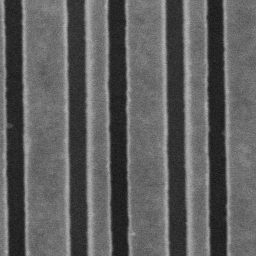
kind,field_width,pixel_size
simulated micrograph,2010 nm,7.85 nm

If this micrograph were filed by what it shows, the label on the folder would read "lines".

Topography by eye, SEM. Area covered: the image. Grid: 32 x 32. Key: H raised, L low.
LLLHHHHHLLLHHLLLHHHHHLLHHHLLHHHH
LLLHHHHHLLLHHLLLHHHHHLLHHHLLHHHH
LLLHHHHHLLLHHLLLHHHHHLLHHHLLHHHH
HLLHHHHHLLLHHLLLHHHHHLLHHHLLHHHH
HLLHHHHHLLLHHHLLHHHHHLLHHHLLHHHH
HLLHHHHHLLLHHHLLHHHHHLLHHHLLHHHH
HLLHHHHHLLLHHHLLHHHHHLLHHHLLHHHH
HLLHHHHHLLLHHHLLHHHHHLLHHHLLHHHH
HLLHHHHHLLLHHHLLHHHHHLLHHHLLHHHH
HLLHHHHHLLLHHHLLHHHHHLLHHHLLHHHH
HLLHHHHHLLLHHLLLHHHHHLLHHHLLHHHH
HLLHHHHHLLLHHHLLHHHHHLLHHHLLHHHH
HLLHHHHHLLLHHHLLHHHHHLLHHHLLHHHH
HLLHHHHHLLLHHHLLHHHHHLLHHHLLHHHH
HLLHHHHHLLLHHHLLHHHHHLLHHHLLHHHH
HLLHHHHHLLLHHHLLHHHHHLLHHHLLHHHH
HLLHHHHHLLLHHHLLHHHHHLLHHHLLHHHH
HLLHHHHHLLLHHHLLHHHHHLLHHHLLHHHH
HLLHHHHHLLLHHHLLHHHHHLLHHHLLHHHH
HLLHHHHHHLLHHHLLHHHHHLLHHHLLHHHH
HLLHHHHHHLLHHHLLHHHHHLLHHHLLHHHH
HLLHHHHHHLLHHHLLHHHHHLLHHHLLHHHH
HLLHHHHHHLLHHHLLHHHHHLLHHHLLHHHH
HLLHHHHHHLLHHHLLHHHHHLLHHHLLHHHH
HLLHHHHHHLLHHHLLHHHHHLLHHHLLHHHH
HLLHHHHHHLLHHHLLHHHHHLLHHHLLHHHH
HLLHHHHHHLLHHHLLHHHHHLLHHHLLHHHH
HLLHHHHHHLLHHHLLHHHHHLLHHHLLHHHH
HLLHHHHHHLLHHHLLHHHHHLLHHHLLHHHH
HLLHHHHHHLLHHHLLHHHHHLLHHHLLHHHH
HLLHHHHHHLLHHHLLHHHHHLLHHHLLHHHH
HLLHHHHHHLLHHHLLHHHHHLLHHHLLHHHH